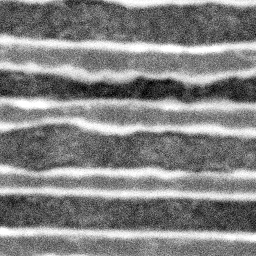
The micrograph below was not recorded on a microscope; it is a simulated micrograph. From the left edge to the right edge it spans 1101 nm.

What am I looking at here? one or a few lines or trenches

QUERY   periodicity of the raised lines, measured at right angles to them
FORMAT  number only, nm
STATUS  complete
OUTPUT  265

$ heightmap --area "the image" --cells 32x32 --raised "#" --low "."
................................
................................
................................
................................
................................
#######...#.....................
################################
################################
###.############################
..........######..##########....
................................
................................
..............##................
################################
################################
#####......#####################
............................####
................................
................................
................................
................................
###....#########..##............
################################
################################
..........................######
................................
................................
................................
................................
#############################..#
################################
################################